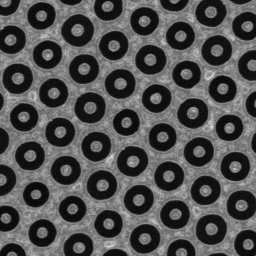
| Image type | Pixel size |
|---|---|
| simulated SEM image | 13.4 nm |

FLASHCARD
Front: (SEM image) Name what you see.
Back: a regular array of ring-shaped grooves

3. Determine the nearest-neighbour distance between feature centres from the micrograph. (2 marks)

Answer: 515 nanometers